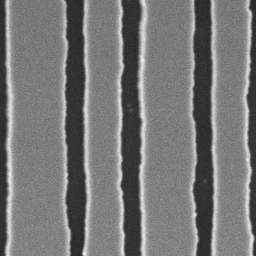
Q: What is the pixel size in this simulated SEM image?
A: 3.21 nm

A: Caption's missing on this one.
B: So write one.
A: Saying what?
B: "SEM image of lines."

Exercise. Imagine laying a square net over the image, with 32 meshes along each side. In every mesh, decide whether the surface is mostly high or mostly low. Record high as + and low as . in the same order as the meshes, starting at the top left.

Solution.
.+++++++...++++...++++++..+++++.
.+++++++...++++...++++++..+++++.
.+++++++...++++...++++++..+++++.
.+++++++..+++++...++++++..+++++.
.+++++++..+++++...++++++...++++.
.+++++++...++++...++++++..+++++.
.+++++++...++++..+++++++..+++++.
.+++++++...++++..+++++++...++++.
.+++++++...++++..+++++++...++++.
.+++++++...++++..+++++++...++++.
.+++++++...++++..+++++++...++++.
.+++++++...++++..+++++++..+++++.
.+++++++...++++..+++++++..+++++.
.+++++++..+++++...++++++...++++.
.+++++++...++++...++++++..+++++.
.+++++++...++++...++++++...++++.
.+++++++...++++...++++++...++++.
.+++++++...++++...++++++...++++.
.+++++++...++++...+++++++..++++.
.+++++++...++++...+++++++..++++.
.+++++++...++++...+++++++..++++.
.+++++++...++++..+++++++...++++.
.+++++++...++++..+++++++...++++.
.+++++++...++++...++++++...++++.
.+++++++...++++...++++++...++++.
.+++++++...++++...++++++...++++.
.+++++++...++++...++++++...++++.
.+++++++...++++...++++++...++++.
.++++++++..++++...+++++++..++++.
.++++++++..+++++..+++++++..+++++
.++++++++..+++++..+++++++.++++++
.++++++++.++++++..+++++++..+++++